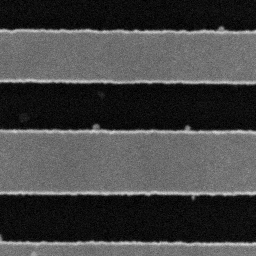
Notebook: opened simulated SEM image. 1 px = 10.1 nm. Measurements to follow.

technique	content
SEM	lines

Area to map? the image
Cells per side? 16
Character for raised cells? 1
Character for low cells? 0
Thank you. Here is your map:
0000000000000000
0000000000000000
1111111111111111
1111111111111111
1111111111111111
0000000000000000
0000000000000000
0000000000000000
1111111111111111
1111111111111111
1111111111111111
1111111111111111
0000000000000000
0000000000000000
0000000000000000
1111111111111111